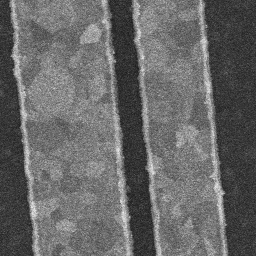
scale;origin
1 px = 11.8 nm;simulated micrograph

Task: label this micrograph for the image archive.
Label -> one or a few lines or trenches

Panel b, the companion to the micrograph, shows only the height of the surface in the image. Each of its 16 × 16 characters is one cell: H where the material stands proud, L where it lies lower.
LHHHHHHLHHHHHLLL
LHHHHHHLLHHHHLLL
LHHHHHHLLHHHHLLL
LHHHHHHLLHHHHLLL
LHHHHHHLLHHHHLLL
LHHHHHHLLHHHHLLL
LHHHHHHLLHHHHLLL
LHHHHHHLLHHHHLLL
LLHHHHHLLHHHHLLL
LLHHHHHLLHHHHLLL
LLHHHHHLLHHHHHLL
LLHHHHHHLHHHHHLL
LLHHHHHHLLHHHHLL
LLHHHHHHLLHHHHLL
LLHHHHHHLLHHHHLL
LLHHHHHHLLHHHHLL